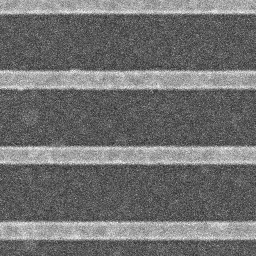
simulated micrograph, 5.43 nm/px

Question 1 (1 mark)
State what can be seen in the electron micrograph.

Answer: one or a few lines or trenches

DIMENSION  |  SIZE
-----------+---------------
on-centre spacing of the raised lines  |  75.4 px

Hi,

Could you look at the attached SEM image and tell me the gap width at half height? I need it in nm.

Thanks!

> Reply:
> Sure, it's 320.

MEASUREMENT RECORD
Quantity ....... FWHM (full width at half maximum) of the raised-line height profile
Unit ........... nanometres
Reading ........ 86.9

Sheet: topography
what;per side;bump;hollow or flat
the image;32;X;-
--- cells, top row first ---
XXXXXXXXXXXXXXXXXXXXXXXXXXXXXXXX
XXXXXXXXXXXXXXXXXXXXXXXXXXXXXXXX
--------------------------------
--------------------------------
--------------------------------
--------------------------------
--------------------------------
--------------------------------
--------------------------------
XXXXXXXXXXXXXXXXXXXXXXXXXXXXXXXX
XXXXXXXXXXXXXXXXXXXXXXXXXXXXXXXX
--------------------------------
--------------------------------
--------------------------------
---X----------------------------
-------------X------------------
--------------------------------
--------------------------------
XXXXXXXXXXXXXXXXXXXXXXXXXXXXXXXX
XXXXXXXXXXXXXXXXXXXXXXXXXXXXXXXX
--------------------------------
--------------------------------
--------------------------------
--------------------------------
--------------------------------
--------------------------------
--------------------------------
--------------------------------
XXXXXXXXXXXXXXXXXXXXXXXXXXXXXXXX
XXXXXXXXXXXXXXXXXXXXXXXXXXXXXXXX
---X----------------------------
--------------------------------